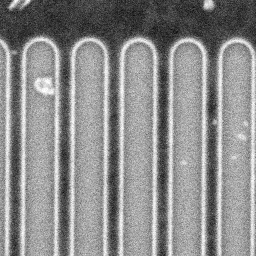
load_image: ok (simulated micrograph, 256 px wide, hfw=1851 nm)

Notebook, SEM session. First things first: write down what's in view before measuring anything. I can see groups of lines, slits or small figures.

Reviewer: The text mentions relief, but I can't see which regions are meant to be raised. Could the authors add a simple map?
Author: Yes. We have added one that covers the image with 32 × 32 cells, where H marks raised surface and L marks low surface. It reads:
HHHHHHHHHHHHHHHHHHHHHHHHHHHHHHHH
HHHHHHHHHHHHHHHHHHHHHHHHHHHHHHHH
HHHHHHHHHHHHHHHHHHHHHHHHHHHHHHHH
HHHHHHHHHHHHHHHHHHHHHHHHHHHHHHHH
HHHHHHHHHHHHHHHHHHHHHHHHHHHHHHHH
HHHHLLHHHHLLHHHHLLHHHHLLLHHHHLLH
LHHLLLLHHLLLLHHHLLLHHHLLLHHHLLLH
LHHLLLLHHLLLLHHLLLLHHHLLLLHHLLLL
LHHLLLLHHLLLLHHLLLLHHLLLLLHHLLLL
LHHLLLLHHLLLLHHLLLLHHLLLLLHHLLLL
LHHLLHLHHLLLLHHLLLLHHLLLLLHHLLLL
LHHLLLLHHLLLLHHLLLLHHLLLLLHHLLLL
LHHLLLLHHLLLLHHLLLLHHLLLLLHHLLLL
LHHLLLLHHLLLLHHLLLLHHLLLLLHHLLLL
LHHLLLLHHLLLLHHLLLLHHLLLLHHHLLLL
LHHLLLLHHLLLLHHLLLLHHLLLLHHHLLLL
LHHLLLLHHLLLLHHLLLLHHLLLLHHHLLLL
LHHLLLLHHLLLLHHLLLLHHLLLLHHHLLLL
LHHLLLLHHLLLLHHLLLLHHLLLLHHHLLLL
LHHLLLLHHLLLLHHLLLLHHLLLLHHHLLLL
LHHLLLLHHLLLLHHLLLLHHLLLLHHHLLLL
LHHLLLLHHLLLLHHLLLLHHLLLLHHHLLLL
LHHLLLLHHLLLLHHLLLLHHLLLLHHHLLLL
LHHLLLLHHLLLLHHLLLLHHLLLLHHHLLLL
LHHLLLLHHLLLLHHLLLLHHLLLLHHHLLLL
LHHLLLLHHLLLLHHLLLLHHLLLLHHHLLLL
LHHLLLLHHLLLLHHLLLLHHLLLLHHHLLLL
LHHLLLLHHLLLLHHLLLLHHLLLLHHHLLLL
LHHLLLLHHLLLLHHLLLLHHLLLLHHLLLLL
LHHLLLLHHLLLLHHLLLLHHLLLLHHLLLLL
LHHLLLLHHLLLLHHLLLLHHLLLLHHLLLLL
LHHLLLLHHLLLLHHLLLLHHLLLLHHLLLLL